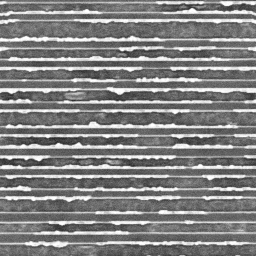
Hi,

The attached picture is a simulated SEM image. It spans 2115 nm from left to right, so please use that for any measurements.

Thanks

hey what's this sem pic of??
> parallel lines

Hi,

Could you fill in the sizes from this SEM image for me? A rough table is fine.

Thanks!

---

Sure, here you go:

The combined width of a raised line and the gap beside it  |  183 nm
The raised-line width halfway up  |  95 nanometers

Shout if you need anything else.